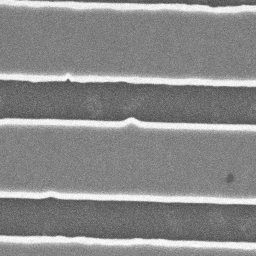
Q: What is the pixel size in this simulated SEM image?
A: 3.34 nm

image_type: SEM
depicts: one or a few lines or trenches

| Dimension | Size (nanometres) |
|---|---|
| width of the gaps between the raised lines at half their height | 146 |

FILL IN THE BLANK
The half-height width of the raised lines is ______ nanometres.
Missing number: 247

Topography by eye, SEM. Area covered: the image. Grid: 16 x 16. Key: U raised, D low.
UUUUUUUUUUUUUDDD
UUUUUUUUUUUUUUUU
UUUUUUUUUUUUUUUU
UUUUUUUUUUUUUUUU
UUUUUUUUUUUUUUUU
DDDDDDDDDDDDDDDD
DDDDDDDDDDDDDDDD
DDDDDDDDDDDDDDDD
UUUUUUUUUUUUUUUU
UUUUUUUUUUUUUUUU
UUUUUUUUUUUUUUUU
UUUUUUUUUUUUUUUU
DDDDDDDDDDDDDUUU
DDDDDDDDDDDDDDDD
DDDDDDDDDDDDDDDD
UUUUUUUUUUUUUUUU